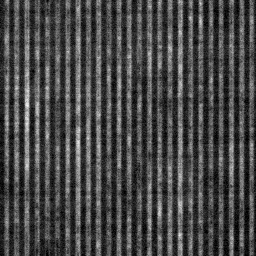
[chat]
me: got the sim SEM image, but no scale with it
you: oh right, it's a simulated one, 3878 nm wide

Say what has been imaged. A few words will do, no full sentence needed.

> parallel lines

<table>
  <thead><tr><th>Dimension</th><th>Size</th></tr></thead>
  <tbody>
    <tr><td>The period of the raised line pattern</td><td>155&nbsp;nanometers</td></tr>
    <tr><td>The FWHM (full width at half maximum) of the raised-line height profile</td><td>0.112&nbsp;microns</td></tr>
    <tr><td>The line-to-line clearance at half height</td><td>43.6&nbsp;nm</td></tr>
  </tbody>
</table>